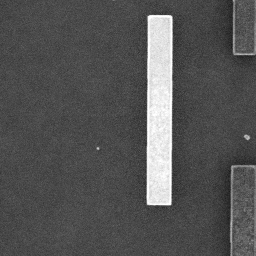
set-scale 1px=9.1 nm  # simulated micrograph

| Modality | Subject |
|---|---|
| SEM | wiring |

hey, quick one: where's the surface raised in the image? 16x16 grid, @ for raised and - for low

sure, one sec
---------------@
---------@@----@
---------@@----@
---------@@-----
---------@@-----
---------@@-----
---------@@-----
---------@@-----
---------@@-----
---------@@-----
---------@@----@
---------@@---@@
---------@@---@@
--------------@@
--------------@@
--------------@@